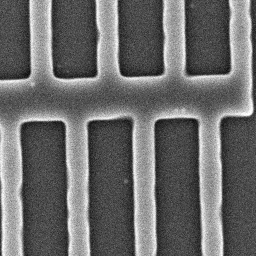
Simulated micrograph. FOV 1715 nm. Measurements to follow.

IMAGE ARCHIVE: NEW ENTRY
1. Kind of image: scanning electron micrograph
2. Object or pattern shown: groups of lines, slits or small figures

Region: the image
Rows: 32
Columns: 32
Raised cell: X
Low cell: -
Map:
----XX------XXX------XX------XX-
----XX------XXX------XX------XX-
----XX------XXX-----XXX------XX-
----XX------XXX-----XXX------XX-
----XX-------XX------XX------XX-
----XX------XXX------XX------XX-
----XX------XXX------XX------XX-
----XX------XXX------XX------XX-
----XX------XXX------XX------XX-
----XXX-----XXX-----XXX----XXXX-
XXXXXXXXXXXXXXXXXXXXXXXXXXXXXXX-
XXXXXXXXXXXXXXXXXXXXXXXXXXXXXXX-
XXXXXXXXXXXXXXXXXXXXXXXXXXXXXXX-
XXXXXXXXXXXXXXXXXXXXXXXXXXXXXXXX
XXXXXXXXXXXXXXXXXXXXXXXXXXXX----
XXX-----XXX------XX------XX-----
XX------XXX------XX------XX-----
XX------XXX------XX------XX-----
XXX-----XXX------XX------XX-----
XXX-----XXX------XX------XX-----
XXX-----XXX------XX------XXX----
XXX------XX------XX------XXX----
XXX------XX------XX------XXX----
XXX------XX------XX------XXX----
XXX------XX------XX------XXX----
XXX------XX------XX------XXX----
XXX------XX------XX------XX-----
XXX------XX------XX------XX-----
XXX------XX------XX------XXX----
XXX------XX------XX------XXX----
XXX------XX------XX------XXX----
XXX------XX------XX------XXX----